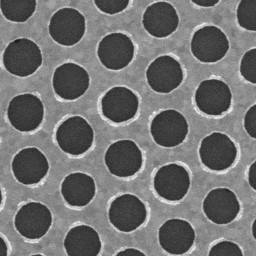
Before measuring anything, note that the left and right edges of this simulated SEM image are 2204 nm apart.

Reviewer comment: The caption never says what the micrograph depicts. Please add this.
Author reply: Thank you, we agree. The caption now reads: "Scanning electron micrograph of a regular array of holes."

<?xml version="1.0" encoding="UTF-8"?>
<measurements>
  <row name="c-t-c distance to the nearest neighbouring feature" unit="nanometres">462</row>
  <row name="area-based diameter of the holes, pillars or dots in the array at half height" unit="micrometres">0.325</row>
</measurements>